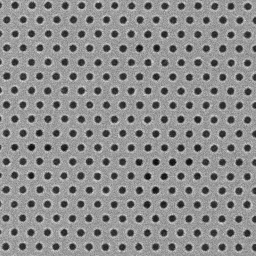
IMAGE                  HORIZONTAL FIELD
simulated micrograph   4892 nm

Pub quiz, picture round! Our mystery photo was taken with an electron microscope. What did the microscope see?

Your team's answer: a regular array of holes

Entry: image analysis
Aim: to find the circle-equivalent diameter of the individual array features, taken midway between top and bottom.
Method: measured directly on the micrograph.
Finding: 151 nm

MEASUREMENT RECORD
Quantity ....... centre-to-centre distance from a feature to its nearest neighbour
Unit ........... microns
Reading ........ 0.308